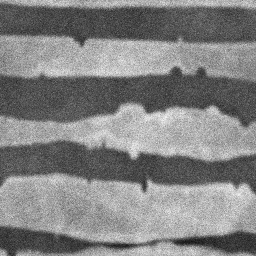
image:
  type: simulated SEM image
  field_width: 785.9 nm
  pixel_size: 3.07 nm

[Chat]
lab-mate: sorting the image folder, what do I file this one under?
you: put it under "one or a few lines or trenches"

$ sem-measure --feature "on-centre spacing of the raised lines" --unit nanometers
234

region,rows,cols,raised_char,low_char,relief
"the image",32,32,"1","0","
00001111111111111011111111111111
00000000000000000000000000000000
00000000000000000000000000000000
00000000000000000000000000000000
00000000000000000000000000000000
11111111110111111111111100000000
11111111111111111111111111111111
11111111111111111111111111111111
11111111111111111111100110111111
00000000000000000000000000001111
00000000000000000000000000000000
00000000000000000000000000000000
00000000000000000000000000000000
00000000000000011100000000100000
00000000000000111111111111110000
11111111111111111111111111111100
11111111111111111111111111111111
11110000111100111111111111111111
00000000000000001111111111111111
00000000000000000000000111111000
00000000000000000000000000000000
00000000000000000000000000000000
01111111110000000000000000000000
11111111111111111111101111111010
11111111111111111111111111111111
11111111111111111111111111111111
11111111111111111111111111111111
11111111111111111111111111111111
00011111111111111111111111111111
00000000011111111111111111000000
00000000000000001111110000000000
00000000000111111111111111100000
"